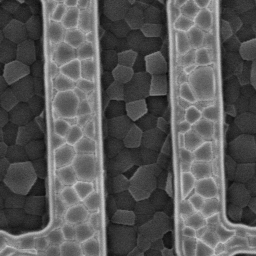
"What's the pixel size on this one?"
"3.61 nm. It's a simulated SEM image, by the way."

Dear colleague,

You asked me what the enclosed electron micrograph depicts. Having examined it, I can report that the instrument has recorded one or a few lines or trenches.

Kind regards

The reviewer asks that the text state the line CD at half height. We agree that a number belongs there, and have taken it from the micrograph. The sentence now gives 186 nanometers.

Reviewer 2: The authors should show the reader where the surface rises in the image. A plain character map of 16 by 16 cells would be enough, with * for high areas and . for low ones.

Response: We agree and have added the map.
...***.....***..
...***.....***..
...***.....***..
...***.....***..
...***.....***..
...***.....***..
...***.....***..
...***.....***..
...***.....***..
...***.....***..
...***.....***..
...***.....***..
...***.....***..
...***.....***..
..****.....*****
*******....*****